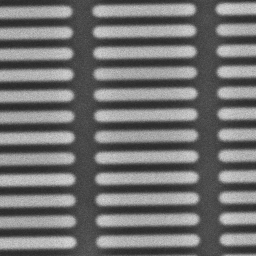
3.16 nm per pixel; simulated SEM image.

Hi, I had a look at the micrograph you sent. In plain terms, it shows groups of lines, slits or small figures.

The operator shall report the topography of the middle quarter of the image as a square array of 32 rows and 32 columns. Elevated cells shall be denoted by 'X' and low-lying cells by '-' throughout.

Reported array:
--------------------------------
XX------XXXXXXXXXXXXXXXXXXXXXXXX
XX------XXXXXXXXXXXXXXXXXXXXXXXX
XX------XXXXXXXXXXXXXXXXXXXXX---
--------------------------------
--------------------------------
---------XXXXXXXXXXXXXXXXXXXXXXX
XX------XXXXXXXXXXXXXXXXXXXXXXXX
XX------XXXXXXXXXXXXXXXXXXXXXXXX
--------------------------------
--------------------------------
--------------------XXXXXXXXXXXX
XX------XXXXXXXXXXXXXXXXXXXXXXXX
XX------XXXXXXXXXXXXXXXXXXXXXXXX
X-------------------------------
--------------------------------
--------------------------------
XX------XXXXXXXXXXXXXXXXXXXXXXXX
XXX-----XXXXXXXXXXXXXXXXXXXXXXXX
XX-------XXXXXXXXXXX------------
--------------------------------
--------------------------------
XX------XXXXXXXXXXXXXXXXXXXXXXXX
XXX-----XXXXXXXXXXXXXXXXXXXXXXXX
XX------XXXXXXXXXXXXXXXXXXXXXXXX
--------------------------------
--------------------------------
XX-------XXXXXXXXXXXXXXXXXXXXXXX
XXX-----XXXXXXXXXXXXXXXXXXXXXXXX
XXX-----XXXXXXXXXXXXXXXXXXXXXXXX
--------------------------------
--------------------------------